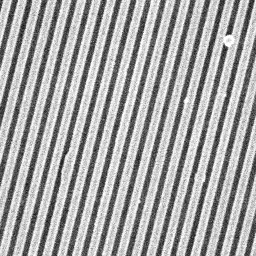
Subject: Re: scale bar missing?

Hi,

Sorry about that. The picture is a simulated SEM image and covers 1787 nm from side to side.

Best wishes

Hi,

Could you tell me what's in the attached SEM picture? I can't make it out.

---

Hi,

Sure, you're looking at parallel lines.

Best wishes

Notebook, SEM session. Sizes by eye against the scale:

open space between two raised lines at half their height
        5.93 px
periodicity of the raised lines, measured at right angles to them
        0.1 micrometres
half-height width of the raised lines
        55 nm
